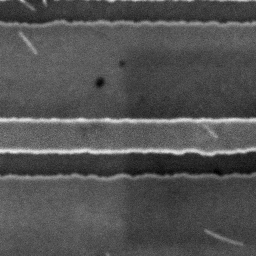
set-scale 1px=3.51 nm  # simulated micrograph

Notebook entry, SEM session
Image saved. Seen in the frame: lines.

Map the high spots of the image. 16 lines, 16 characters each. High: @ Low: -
----------------
----------------
----------------
----------------
----------------
----------------
----------------
@@@@@@@@---@@@@@
@@@@@@@@@@@@@@@@
@@@@@@@@@@@@@@@-
----------------
----------------
----------------
----------------
----------------
----------------